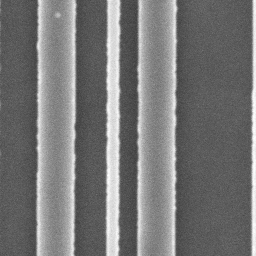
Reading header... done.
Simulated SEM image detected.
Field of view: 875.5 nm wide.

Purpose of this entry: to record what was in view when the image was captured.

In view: lines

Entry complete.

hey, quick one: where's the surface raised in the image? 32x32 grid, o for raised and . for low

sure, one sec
.....oooo.....o..ooooo..........
.....oooo.....o..ooooo..........
.....oooo.....o..ooooo..........
.....oooo.....o..ooooo..........
.....oooo.....o..ooooo..........
.....oooo....oo..ooooo..........
.....oooo....oo..ooooo..........
.....oooo.....o..ooooo..........
.....oooo....oo..ooooo..........
.....oooo....oo..ooooo..........
.....oooo....oo..ooooo..........
.....oooo....oo..ooooo..........
.....oooo....oo..ooooo..........
.....oooo....oo..ooooo..........
.....oooo....oo..ooooo..........
.....oooo....oo..ooooo..........
.....oooo....oo..ooooo..........
.....oooo....oo..ooooo..........
.....oooo....oo..ooooo..........
.....oooo....oo..ooooo..........
.....oooo....oo..ooooo..........
.....oooo....oo..ooooo..........
.....oooo....oo..ooooo..........
.....oooo....oo..ooooo..........
.....oooo....oo..ooooo..........
.....oooo....oo..ooooo..........
.....oooo....oo..ooooo..........
.....oooo....oo..ooooo..........
.....oooo....oo..ooooo..........
.....oooo....oo..ooooo..........
.....oooo....oo..ooooo..........
.....oooo....oo..ooooo..........